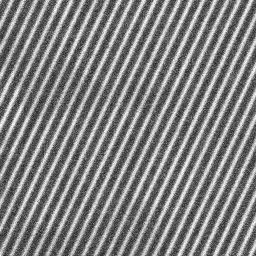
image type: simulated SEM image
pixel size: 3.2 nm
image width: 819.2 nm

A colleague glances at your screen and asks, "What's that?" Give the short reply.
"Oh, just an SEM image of parallel lines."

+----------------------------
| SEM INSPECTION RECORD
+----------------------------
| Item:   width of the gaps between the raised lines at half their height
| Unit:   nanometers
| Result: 28.2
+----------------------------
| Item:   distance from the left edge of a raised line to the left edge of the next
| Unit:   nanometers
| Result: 34.6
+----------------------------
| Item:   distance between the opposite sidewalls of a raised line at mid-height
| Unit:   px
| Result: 1.81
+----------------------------